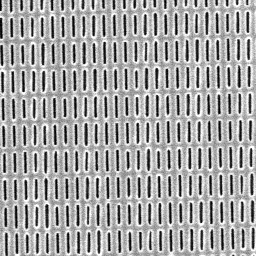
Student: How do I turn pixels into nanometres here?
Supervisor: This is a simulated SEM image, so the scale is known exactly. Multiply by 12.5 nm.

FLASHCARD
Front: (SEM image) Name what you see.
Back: a regular array of holes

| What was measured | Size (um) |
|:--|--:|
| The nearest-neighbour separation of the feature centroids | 0.126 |